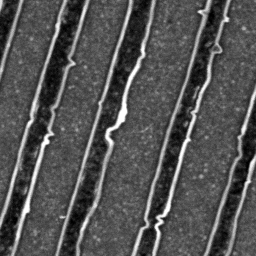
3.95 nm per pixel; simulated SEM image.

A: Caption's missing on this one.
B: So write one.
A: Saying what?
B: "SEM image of one or a few lines or trenches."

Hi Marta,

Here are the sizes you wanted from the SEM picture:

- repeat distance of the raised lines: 273 nanometres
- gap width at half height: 191 nm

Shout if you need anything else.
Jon